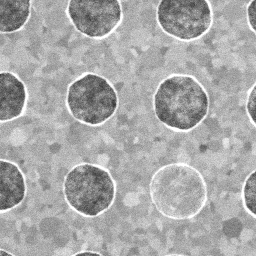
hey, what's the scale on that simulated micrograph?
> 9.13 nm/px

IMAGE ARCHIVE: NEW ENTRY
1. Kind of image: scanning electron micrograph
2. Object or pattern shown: holes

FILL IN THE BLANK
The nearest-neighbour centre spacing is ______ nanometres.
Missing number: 811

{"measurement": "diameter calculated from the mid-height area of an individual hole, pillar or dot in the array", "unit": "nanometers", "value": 479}